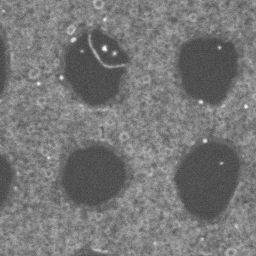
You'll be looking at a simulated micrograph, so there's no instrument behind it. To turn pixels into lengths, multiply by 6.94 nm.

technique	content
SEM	raised bodies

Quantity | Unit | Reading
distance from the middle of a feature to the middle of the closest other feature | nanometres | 761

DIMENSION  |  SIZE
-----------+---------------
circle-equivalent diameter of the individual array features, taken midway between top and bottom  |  499 nanometers